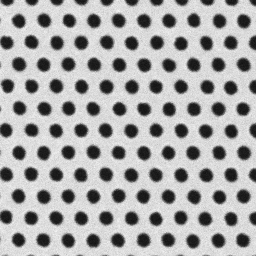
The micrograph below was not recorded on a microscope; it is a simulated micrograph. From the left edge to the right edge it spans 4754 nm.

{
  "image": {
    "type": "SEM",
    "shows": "a regular array of holes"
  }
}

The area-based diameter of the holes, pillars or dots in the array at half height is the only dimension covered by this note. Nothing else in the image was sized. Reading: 0.276 µm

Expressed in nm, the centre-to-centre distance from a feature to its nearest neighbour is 454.